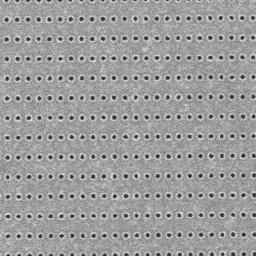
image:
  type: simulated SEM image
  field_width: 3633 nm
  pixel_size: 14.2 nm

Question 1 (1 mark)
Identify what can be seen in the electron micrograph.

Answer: a regular array of holes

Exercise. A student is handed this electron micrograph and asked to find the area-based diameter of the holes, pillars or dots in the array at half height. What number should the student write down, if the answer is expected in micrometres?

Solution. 0.0679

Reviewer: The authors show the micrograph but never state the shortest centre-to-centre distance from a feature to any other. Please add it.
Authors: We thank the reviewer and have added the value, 0.151 micrometres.